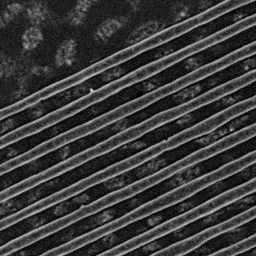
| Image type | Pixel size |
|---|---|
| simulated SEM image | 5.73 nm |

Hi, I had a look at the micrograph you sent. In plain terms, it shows parallel lines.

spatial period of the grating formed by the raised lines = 142 nm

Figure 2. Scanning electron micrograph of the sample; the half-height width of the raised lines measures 62.6 nm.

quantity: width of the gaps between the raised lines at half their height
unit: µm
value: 0.0833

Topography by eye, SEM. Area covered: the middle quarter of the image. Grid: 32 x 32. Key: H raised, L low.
LLLLLLLHHHHHLLLLLLLLHHHHHHLLLLLL
LLLLLHHHHHLLLLLLLLHHHHHHHLLLLLLL
LLLHHHHHLLLLLLLLHHHHHHHLLLLLLLLH
LHHHHHLLLLLLLLHHHHHHHLLLLLLLLHHH
HHHHLLLLLLLLHHHHHHLLLLLLLLLHHHHH
HHLLLLLLLLHHHHHHLLLLLLLLLHHHHHLL
LLLLLLLLHHHHHHLLLLLLLLLHHHHHHLLL
LLLLLLHHHHHHLLLLLLLLLHHHHHLLLLLL
LLLLHHHHHHLLLLLLLLLHHHHHLLLLLLLL
LLLHHHHHLLLLLLLLHHHHHHHLLLLLLLLH
HHHHHHLLLLLLLLHHHHHHHLLLLLLLLHHH
HHHHLLLLLLLLHHHHHHHLLLLLLLHHHHHH
HHHLLLLLLLHHHHHHHLLLLLLLHHHHHHLL
LLLLLLLLHHHHHHLLLLLLLHHHHHHHLLLL
LLLLLLHHHHHHLLLLLLLLHHHHHHLLLLLL
LLLLHHHHHHLLLLLLLLHHHHHHLLLLLLLL
LLHHHHHHLLLLLLLHHHHHHHLLLLLLLLHH
HHHHHHLLLLLLLHHHHHHHLLLLLLLLHHHH
HHHHLLLLLLLLHHHHHHLLLLLLLLHHHHHH
HLLLLLLLLLHHHHHHLLLLLLLLHHHHHHHL
LLLLLLLLHHHHHHLLLLLLLLHHHHHHHLLL
LLLLLLHHHHHHLLLLLLLLLHHHHHLLLLLL
LLLHHHHHHHLLLLLLLLHHHHHHLLLLLLLL
LLHHHHHLLLLLLLLLHHHHHHLLLLLLLLHH
HHHHHLLLLLLLLLHHHHHHLLLLLLLLHHHH
HHHHLLLLLLLLHHHHHHLLLLLLLLHHHHHL
HHLLLLLLLLHHHHHHLLLLLLLLLHHHHLLL
LLLLLLLLHHHHHHLLLLLLLLLHHHHLLLLL
LLLLLHHHHHHHLLLLLLLLHHHHHHLLLLLL
LLLHHHHHHLLLLLLLLLHHHHHHLLLLLLLL
LLHHHHHLLLLLLLLLHHHHHHLLLLLLLLHH
HHHHHLLLLLLLLLHHHHHHLLLLLLLHHHHH